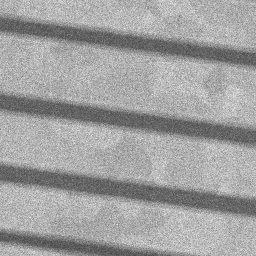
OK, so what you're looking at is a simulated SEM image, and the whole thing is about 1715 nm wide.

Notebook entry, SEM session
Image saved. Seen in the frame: one or a few lines or trenches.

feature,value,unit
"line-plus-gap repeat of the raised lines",480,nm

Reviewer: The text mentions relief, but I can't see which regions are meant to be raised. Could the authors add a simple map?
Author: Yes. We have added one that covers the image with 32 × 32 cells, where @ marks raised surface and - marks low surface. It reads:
@@@@@@@@@@@@@@@@@@@@@@@@@@@@@@@@
@@@@@@@@@@@@@@@@@@@@@@@@@@@@@@@@
-----@@@@@@@@@@@@@@@@@@@@@@@@@@@
------------@@@@@@@@@@@@@@@@@@@@
@@------------------@@@@@@@@@@@@
@@@@@@@@@------------------@@@@@
@@@@@@@@@@@@@@@@----------------
@@@@@@@@@@@@@@@@@@@@@@@---------
@@@@@@@@@@@@@@@@@@@@@@@@@@@@@@@-
@@@@@@@@@@@@@@@@@@@@@@@@@@@@@@@@
@@@@@@@@@@@@@@@@@@@@@@@@@@@@@@@@
-@@@@@@@@@@@@@@@@@@@@@@@@@@@@@@@
--------@@@@@@@@@@@@@@@@@@@@@@@@
---------------@@@@@@@@@@@@@@@@@
@@@-------------------@@@@@@@@@@
@@@@@@@@@@--------------------@@
@@@@@@@@@@@@@@@@@---------------
@@@@@@@@@@@@@@@@@@@@@@@@@-------
@@@@@@@@@@@@@@@@@@@@@@@@@@@@@@@@
@@@@@@@@@@@@@@@@@@@@@@@@@@@@@@@@
--@@@@@@@@@@@@@@@@@@@@@@@@@@@@@@
----------@@@@@@@@@@@@@@@@@@@@@@
-----------------@@@@@@@@@@@@@@@
@@@---------------------@@@@@@@@
@@@@@@@@@@---------------------@
@@@@@@@@@@@@@@@@@@--------------
@@@@@@@@@@@@@@@@@@@@@@@@--------
@@@@@@@@@@@@@@@@@@@@@@@@@@@@@@@@
@@@@@@@@@@@@@@@@@@@@@@@@@@@@@@@@
-------@@@@@@@@@@@@@@@@@@@@@@@@@
--------------@@@@@@@@@@@@@@@@@@
@@@@@@@---------------@@@@@@@@@@